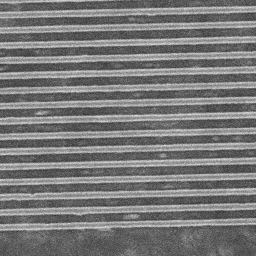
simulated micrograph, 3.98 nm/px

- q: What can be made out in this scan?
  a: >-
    parallel lines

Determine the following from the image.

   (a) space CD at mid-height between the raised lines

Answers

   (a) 38.3 nm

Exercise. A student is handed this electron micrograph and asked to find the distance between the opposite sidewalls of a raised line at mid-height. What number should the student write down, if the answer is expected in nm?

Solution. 19.4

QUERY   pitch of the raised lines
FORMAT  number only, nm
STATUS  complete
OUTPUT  60.3